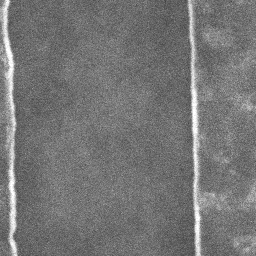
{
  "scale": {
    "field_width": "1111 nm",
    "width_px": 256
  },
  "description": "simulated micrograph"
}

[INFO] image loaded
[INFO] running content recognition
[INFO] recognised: one or a few lines or trenches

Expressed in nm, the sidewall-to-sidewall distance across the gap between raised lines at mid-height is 785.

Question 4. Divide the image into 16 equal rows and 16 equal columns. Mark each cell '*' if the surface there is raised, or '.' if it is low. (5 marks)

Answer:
............****
............****
*...........****
*...........****
*...........****
*...........****
*...........****
*...........****
*...........****
*...........****
*...........****
*...........****
*...........****
*...........****
*...........****
*...........****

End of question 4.